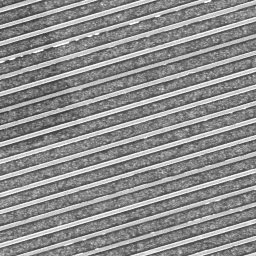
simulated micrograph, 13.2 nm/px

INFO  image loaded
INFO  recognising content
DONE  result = parallel lines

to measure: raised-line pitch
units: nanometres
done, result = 214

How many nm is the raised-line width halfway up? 46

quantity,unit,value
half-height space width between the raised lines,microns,0.171